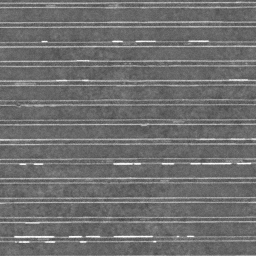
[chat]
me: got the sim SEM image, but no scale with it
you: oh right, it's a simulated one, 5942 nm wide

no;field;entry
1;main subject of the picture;parallel lines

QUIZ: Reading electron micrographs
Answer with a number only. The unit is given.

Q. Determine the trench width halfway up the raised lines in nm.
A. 334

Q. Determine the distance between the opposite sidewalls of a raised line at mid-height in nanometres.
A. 104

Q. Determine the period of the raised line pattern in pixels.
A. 19.5